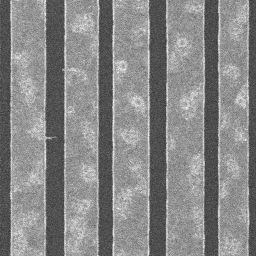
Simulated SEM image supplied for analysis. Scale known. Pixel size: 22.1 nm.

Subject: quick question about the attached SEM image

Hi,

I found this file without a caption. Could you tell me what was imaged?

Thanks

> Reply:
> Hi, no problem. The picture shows parallel lines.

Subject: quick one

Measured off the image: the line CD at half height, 0.762 micrometres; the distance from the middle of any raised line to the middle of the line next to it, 1140 nm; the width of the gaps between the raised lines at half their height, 362 nanometres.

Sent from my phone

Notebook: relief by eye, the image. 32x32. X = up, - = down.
-XXXXX--XXXX--XXXXX--XXXX--XXXX-
-XXXXX--XXXX--XXXXX--XXXX--XXXX-
-XXXXX--XXXX--XXXXX--XXXX--XXXX-
-XXXXX--XXXX--XXXXX--XXXX--XXXX-
-XXXXX--XXXX--XXXXX--XXXX--XXXX-
--XXXX--XXXX--XXXXX--XXXX--XXXX-
--XXXX--XXXX--XXXXX--XXXX--XXXX-
-XXXXX--XXXX--XXXXX--XXXX--XXXX-
-XXXXX--XXXX--XXXXX--XXXX--XXXX-
-XXXXX--XXXX--XXXXX--XXXX--XXXX-
-XXXXX--XXXX--XXXXX--XXXX--XXXX-
-XXXXX--XXXX--XXXXX--XXXX--XXXX-
-XXXXX--XXXX--XXXXX--XXXX--XXXX-
-XXXXX--XXXX--XXXXX--XXXX--XXXX-
-XXXXX--XXXX--XXXXX--XXXX--XXXX-
-XXXXX--XXXX--XXXXX--XXXX--XXXX-
--XXXX--XXXX--XXXXX--XXXX--XXXX-
-XXXXX--XXXX--XXXXX--XXXX--XXXX-
-XXXXX--XXXX--XXXXX--XXXX--XXXX-
-XXXXX--XXXX--XXXXX--XXXX--XXXX-
-XXXXX--XXXX--XXXXX--XXXX--XXXX-
-XXXXX--XXXX--XXXXX--XXXX--XXXX-
-XXXXX--XXXX--XXXXX--XXXX--XXXX-
-XXXXX--XXXX--XXXXX--XXXX--XXXX-
-XXXXX--XXXX--XXXXX--XXXX--XXXX-
--XXXX--XXXX--XXXXX--XXXX--XXXX-
--XXXX--XXXX--XXXXX--XXXX--XXXX-
--XXXX--XXXX--XXXXX--XXXX--XXXX-
--XXXX--XXXX--XXXXX--XXXX--XXXX-
--XXXX--XXXX--XXXXX--XXXX--XXXX-
-XXXXX--XXXX--XXXXX--XXXX--XXXX-
-XXXXX--XXXX--XXXXX--XXXX--XXXX-